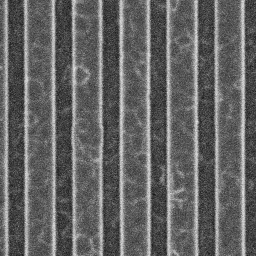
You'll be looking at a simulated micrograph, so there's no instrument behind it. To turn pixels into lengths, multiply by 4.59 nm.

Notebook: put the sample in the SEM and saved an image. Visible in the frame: parallel lines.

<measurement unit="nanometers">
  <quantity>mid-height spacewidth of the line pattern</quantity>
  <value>86.6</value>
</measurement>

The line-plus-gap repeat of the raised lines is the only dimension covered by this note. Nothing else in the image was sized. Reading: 218 nanometers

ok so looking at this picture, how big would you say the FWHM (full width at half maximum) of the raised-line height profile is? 0.132 µm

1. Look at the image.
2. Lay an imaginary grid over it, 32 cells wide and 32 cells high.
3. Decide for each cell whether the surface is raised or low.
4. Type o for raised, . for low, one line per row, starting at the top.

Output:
o..oooo..oooo..oooo..oooo..ooo..
o..oooo..oooo..oooo..oooo..ooo..
o..oooo..oooo..oooo..oooo..ooo..
o..oooo..oooo..oooo..oooo..ooo..
o..oooo..oooo..oooo..ooo...ooo..
o..oooo..oooo..oooo..ooo...ooo..
o..oooo..oooo..oooo..ooo...ooo..
o..oooo..oooo..oooo..ooo...ooo..
o..oooo..oooo..oooo..ooo...ooo..
o..oooo..oooo..oooo..ooo...ooo..
o..oooo..oooo..oooo..ooo...ooo..
o..oooo..oooo..oooo..oooo..ooo..
o..oooo..oooo..oooo..oooo..ooo..
o..oooo..oooo..oooo..oooo..ooo..
o..oooo..oooo..oooo..oooo..ooo..
o..oooo..oooo..oooo..oooo..ooo..
o..oooo..oooo..oooo..oooo..ooo..
o..oooo..oooo..oooo..oooo..ooo..
o..oooo..oooo..oooo..oooo..ooo..
o..oooo..oooo..oooo..oooo..ooo..
o..oooo..oooo..oooo..oooo..ooo..
o..oooo..oooo..oooo..oooo..ooo..
o..oooo..oooo..oooo..oooo..ooo..
o..oooo..oooo..oooo..oooo..ooo..
o..oooo..oooo..oooo..oooo..ooo..
o..oooo..oooo..oooo..oooo..ooo..
o..oooo..oooo..oooo..oooo..ooo..
o..oooo..oooo..oooo..oooo..ooo..
o..oooo..oooo..oooo..oooo..ooo..
o..oooo..oooo..oooo..oooo..ooo..
o..oooo..oooo..oooo..oooo..ooo..
o..oooo..oooo..oooo..oooo..oooo.